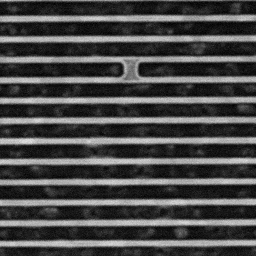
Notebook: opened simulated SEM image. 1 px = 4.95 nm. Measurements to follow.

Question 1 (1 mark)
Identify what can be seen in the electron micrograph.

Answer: parallel lines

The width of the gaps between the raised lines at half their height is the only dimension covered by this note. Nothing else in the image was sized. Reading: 83.5 nm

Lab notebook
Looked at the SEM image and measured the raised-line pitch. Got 0.101 µm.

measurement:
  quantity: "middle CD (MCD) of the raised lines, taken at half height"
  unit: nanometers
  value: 19.2